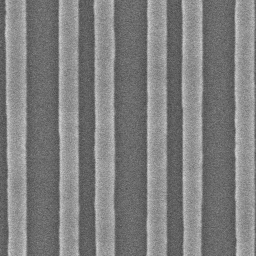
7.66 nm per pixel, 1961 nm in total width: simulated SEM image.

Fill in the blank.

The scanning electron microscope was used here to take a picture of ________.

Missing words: lines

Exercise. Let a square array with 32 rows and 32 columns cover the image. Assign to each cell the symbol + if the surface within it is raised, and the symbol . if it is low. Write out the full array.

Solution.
.++....+++..++....+++..++.....++
.++....+++..++....+++..++....+++
.++....+++..++....+++..++....+++
.++....+++..++....+++..++.....++
.++....+++..++....+++..++.....++
.++....+++..++....+++..++....+++
.++....+++..++....+++..++....+++
.++....+++..++....+++..++....+++
.++....+++..++....+++..++....+++
.++....+++..++....+++..++....+++
.++....+++..++....+++..++....+++
.++....+++..++....+++..++....+++
.++....+++..++....+++..++....+++
.++....+++..++....+++..++.....++
.++....+++..++....+++..++....+++
.++....+++..++....+++..++....+++
.++....+++..++....+++..++.....++
.++.....++..++....+++..++.....++
.++.....++..++....+++..++....+++
.++.....++..++....+++..++.....++
.++.....++..++....+++..++.....++
.++.....++..++....+++..++.....++
.++.....++..++....+++..++.....++
.++.....++..++....+++..++.....++
.++.....++..++....+++..++.....++
.++.....++..++....+++..++.....++
.++.....++..++....+++..++.....++
.++.....++..++....+++..++.....++
.++.....++..++....+++..++.....++
.++.....++..++....+++..++.....++
.++.....++..++....+++..++.....++
.++.....++..++....+++..++.....++